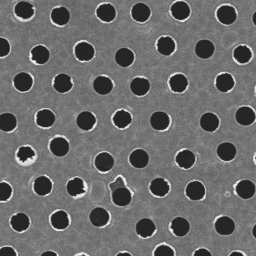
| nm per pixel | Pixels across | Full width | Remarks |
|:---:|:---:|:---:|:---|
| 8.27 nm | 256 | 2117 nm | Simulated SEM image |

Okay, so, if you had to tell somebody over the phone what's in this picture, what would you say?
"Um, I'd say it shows a regular array of holes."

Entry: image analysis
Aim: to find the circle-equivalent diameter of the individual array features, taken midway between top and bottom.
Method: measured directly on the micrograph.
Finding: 155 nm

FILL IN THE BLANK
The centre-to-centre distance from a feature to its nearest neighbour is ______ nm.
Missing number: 290